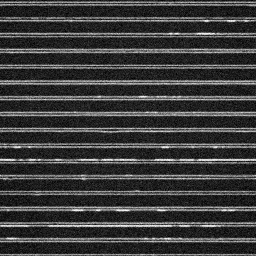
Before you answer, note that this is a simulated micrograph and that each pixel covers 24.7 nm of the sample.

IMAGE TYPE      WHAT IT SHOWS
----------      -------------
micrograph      parallel lines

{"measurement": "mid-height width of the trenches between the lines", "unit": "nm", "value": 321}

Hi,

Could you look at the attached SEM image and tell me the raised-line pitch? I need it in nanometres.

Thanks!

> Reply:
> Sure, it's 389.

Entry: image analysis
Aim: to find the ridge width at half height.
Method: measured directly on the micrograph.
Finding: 0.0648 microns